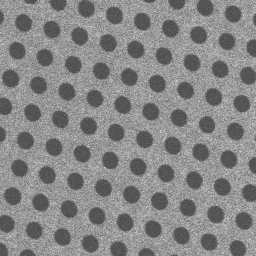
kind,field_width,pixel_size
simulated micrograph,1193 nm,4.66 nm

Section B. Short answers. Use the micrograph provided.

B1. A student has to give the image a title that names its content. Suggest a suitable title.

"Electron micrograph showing a regular array of holes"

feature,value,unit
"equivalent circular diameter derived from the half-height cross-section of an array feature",0.0789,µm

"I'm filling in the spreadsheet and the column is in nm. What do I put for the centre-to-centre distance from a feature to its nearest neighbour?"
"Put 132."